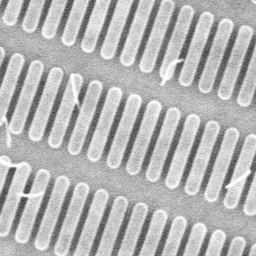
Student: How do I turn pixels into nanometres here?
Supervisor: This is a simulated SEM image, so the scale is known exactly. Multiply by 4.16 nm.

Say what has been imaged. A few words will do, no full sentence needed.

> groups of lines, slits or small figures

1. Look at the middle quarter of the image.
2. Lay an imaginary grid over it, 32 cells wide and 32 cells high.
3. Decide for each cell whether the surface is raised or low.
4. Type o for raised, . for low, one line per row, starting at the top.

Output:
...................ooo..oooo..oo
...................ooo..oooo.ooo
..o.....................ooo..ooo
.ooo.....................o...ooo
.oooo..oo....................ooo
.ooo..ooo.......................
oooo..ooo...oo..................
oooo.oooo..ooo..................
ooo..oooo..ooo..ooo.............
ooo..ooo..oooo..ooo.............
oo...ooo..ooo..oooo..ooo........
oo..oooo..ooo..oooo..ooo..ooo...
oo..ooo..oooo..ooo..oooo..ooo...
o...ooo..ooo..oooo..ooo..oooo..o
o..ooo...ooo..oooo..ooo..oooo.oo
o..ooo..oooo..ooo..oooo..ooo..oo
..oooo..ooo..oooo..ooo..oooo..oo
..ooo...ooo..ooo...ooo..ooo..ooo
..ooo..oooo..ooo..ooo...ooo..ooo
.oooo..ooo..oooo..ooo..oooo..ooo
.oooo.oooo..ooo..oooo..ooo...ooo
.ooo..oooo..ooo..oooo.oooo..ooo.
......ooo..oooo..ooo..oooo..ooo.
......ooo..ooo..oooo..ooo..oooo.
...........ooo..oooo.oooo..ooo..
...........oo...ooo..oooo..ooo..
................ooo..ooo..oooo..
.....................ooo..ooo..o
o....................oo...ooo..o
o.........................ooo..o
o..ooo....................oo..oo
o..ooo........................oo